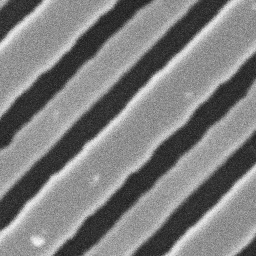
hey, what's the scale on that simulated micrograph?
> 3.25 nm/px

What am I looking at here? lines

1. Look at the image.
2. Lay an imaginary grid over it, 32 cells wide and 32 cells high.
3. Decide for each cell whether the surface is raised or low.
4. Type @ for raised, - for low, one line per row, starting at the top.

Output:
-----@@@@@@@@@-----@@@@@----@@@@
----@@@@@@@@@----@@@@@@-----@@@@
---@@@@@@@@@----@@@@@@-----@@@@@
--@@@@@@@@@----@@@@@@-----@@@@@@
-@@@@@@@@@----@@@@@@-----@@@@@@@
@@@@@@@@@----@@@@@@-----@@@@@@@@
@@@@@@@@----@@@@@@-----@@@@@@@@@
@@@@@@@----@@@@@@-----@@@@@@@@@-
@@@@@@----@@@@@@-----@@@@@@@@@--
@@@@@----@@@@@@----@@@@@@@@@@---
@@@@----@@@@@@-----@@@@@@@@-----
@@@----@@@@@@----@@@@@@@@@@----@
@@----@@@@@@----@@@@@@@@@@----@@
@----@@@@@@-----@@@@@@@@-----@@@
----@@@@@@-----@@@@@@@@@----@@@@
---@@@@@@-----@@@@@@@@@----@@@@@
--@@@@@@-----@@@@@@@@@----@@@@@@
--@@@@@-----@@@@@@@@-----@@@@@@-
-@@@@@-----@@@@@@@@-----@@@@@@--
@@@@@-----@@@@@@@@@----@@@@@----
@@@@-----@@@@@@@@@----@@@@@-----
@@@-----@@@@@@@@@----@@@@@-----@
@@----@@@@@@@@@@----@@@@@-----@@
@----@@@@@@@@@@----@@@@@-----@@@
-----@@@@@@@@@----@@@@@-----@@@@
---@@@@@@@@@@----@@@@@-----@@@@@
---@@@@@@@@@----@@@@@-----@@@@@@
--@@@@@@@@-----@@@@@@----@@@@@@@
-@@@@@@@@@----@@@@@@----@@@@@@@@
@@@@@@@@@----@@@@@@----@@@@@@@@@
@@@@@@@@----@@@@@@----@@@@@@@@@-
@@@@@@@----@@@@@@----@@@@@@@@@--